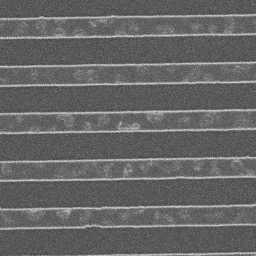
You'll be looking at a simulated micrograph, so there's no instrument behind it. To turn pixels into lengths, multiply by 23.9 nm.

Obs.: parallel lines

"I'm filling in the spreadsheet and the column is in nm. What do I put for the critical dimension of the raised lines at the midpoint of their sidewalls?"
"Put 474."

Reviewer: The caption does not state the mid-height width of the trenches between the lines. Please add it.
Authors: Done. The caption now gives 668 nm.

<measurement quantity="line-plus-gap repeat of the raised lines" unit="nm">1140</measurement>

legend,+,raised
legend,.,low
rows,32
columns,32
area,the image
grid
................................
................................
++++++++++++++++++++++++++++++++
++++++++++++++++++++++++++++++++
+++++++.+.+++++.................
................................
................................
................................
++++++++++++++++++++++++++++++++
++++++++++++++++++++++++++++++++
++++++++++++++..................
................................
................................
................................
++++++++++++++++++++++++++++++++
++++++++++++++++++++++++++++++++
+++++++.........................
................................
................................
................................
+++++++++++++++++++++++++++++.++
++++++++++++++++++++++++++++++++
+++++++.........................
................................
................................
................................
++++++++++++++++++++++++++++++++
++++++++++++++++++++++++++++++++
++.+++..........................
................................
................................
................................